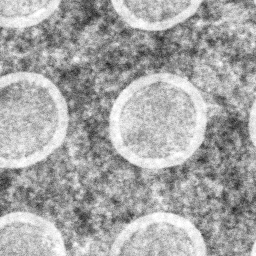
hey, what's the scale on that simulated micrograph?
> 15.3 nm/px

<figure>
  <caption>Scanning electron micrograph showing raised bodies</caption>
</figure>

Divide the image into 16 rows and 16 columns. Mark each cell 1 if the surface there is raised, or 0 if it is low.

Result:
1110000011110000
0000000001000000
0000000000000000
0000000000000000
0000000000000000
1110000011110000
1111000111110000
1111000111111000
1111000111110000
1110000011110000
0000000000000000
0000000000000000
0000000000000000
0000000000000000
1110000011110000
1111000111111000